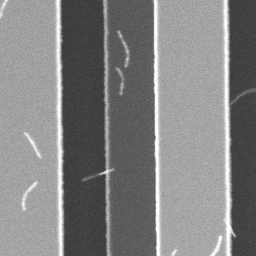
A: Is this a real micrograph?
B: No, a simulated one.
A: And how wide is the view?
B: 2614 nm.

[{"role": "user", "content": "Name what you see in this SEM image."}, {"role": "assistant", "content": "lines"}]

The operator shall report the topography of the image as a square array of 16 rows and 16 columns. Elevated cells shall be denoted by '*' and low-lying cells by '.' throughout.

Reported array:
****...*******..
****...*******..
****...*******..
****...*******..
****...*******..
****...*******..
****...*******..
****...*******..
****...*******..
****...*******..
****...*******..
****...*******..
****...*******..
****...*******..
****...*******..
****...*******..